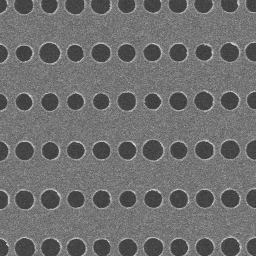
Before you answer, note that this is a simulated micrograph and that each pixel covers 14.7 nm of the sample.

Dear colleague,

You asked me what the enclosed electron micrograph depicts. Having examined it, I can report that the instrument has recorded a regular array of holes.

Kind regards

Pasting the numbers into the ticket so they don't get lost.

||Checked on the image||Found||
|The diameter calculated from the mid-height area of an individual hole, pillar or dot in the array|261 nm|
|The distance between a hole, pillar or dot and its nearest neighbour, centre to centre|376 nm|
